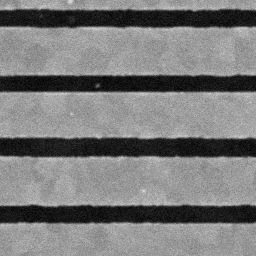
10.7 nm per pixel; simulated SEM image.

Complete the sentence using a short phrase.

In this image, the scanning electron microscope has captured lines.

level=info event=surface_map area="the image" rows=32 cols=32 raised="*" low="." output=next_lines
********************************
................................
................................
*****....*****.***...****.**.***
********************************
********************************
********************************
********************************
********************************
................................
................................
................................
********************************
********************************
********************************
********************************
********************************
................................
................................
................................
********************************
********************************
********************************
********************************
********************************
********************************
................................
................................
********************************
********************************
********************************
********************************